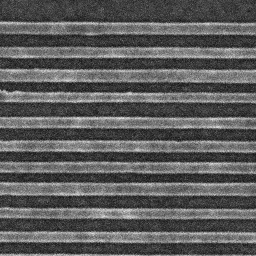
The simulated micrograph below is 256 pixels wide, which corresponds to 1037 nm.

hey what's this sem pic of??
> parallel lines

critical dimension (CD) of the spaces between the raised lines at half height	52.2	nm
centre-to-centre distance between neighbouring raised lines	94	nanometers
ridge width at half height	41	nanometres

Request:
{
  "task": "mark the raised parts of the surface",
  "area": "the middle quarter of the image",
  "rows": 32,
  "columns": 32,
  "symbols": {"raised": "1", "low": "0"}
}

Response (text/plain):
00000000000000000000000000000000
00000000000000000000000000000000
11111111111111111111111111111111
11111111111111111111111111111111
00000000000000000000000000000000
00000000000000000000000000000000
00000000000000000000000000000000
11111111111111111111111111111111
11111111111111111111111111111111
00000000000000000000000000000000
00000000000000000000000000000000
00000000000000000000000000000000
00000000000000000000000000000000
00000000000000000000000000000000
11111111111111111111111111111111
11111111111111111111111111111111
00000000000000000000000000000000
00000000000000000000000000000000
00000000000000000000000000000000
11111111111111111111111111110001
11111111111111111111111111111111
11111111111111111111111111111111
00000000000000000000000000000000
00000000000000000000000000000000
00000000000000000000000000000000
11111111111111111111111111111111
11111111111111111111111111111111
00000000000000000000000000000000
00000000000000000000000000000000
00000000000000000000000000000000
11111111111111111111111111111111
11111111111111111111111111111111